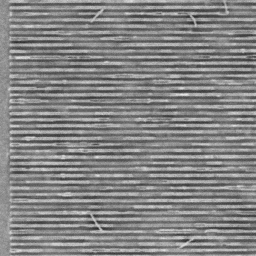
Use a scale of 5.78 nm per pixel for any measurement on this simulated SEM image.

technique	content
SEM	parallel lines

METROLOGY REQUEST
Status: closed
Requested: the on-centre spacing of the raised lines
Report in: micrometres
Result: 0.036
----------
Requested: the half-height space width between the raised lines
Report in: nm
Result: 18.8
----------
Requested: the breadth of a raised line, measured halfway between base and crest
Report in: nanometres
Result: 14.4